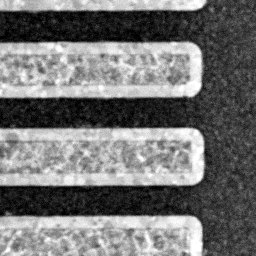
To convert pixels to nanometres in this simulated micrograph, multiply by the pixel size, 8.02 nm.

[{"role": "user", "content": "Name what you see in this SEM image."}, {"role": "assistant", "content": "one or a few lines or trenches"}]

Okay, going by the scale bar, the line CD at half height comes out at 0.368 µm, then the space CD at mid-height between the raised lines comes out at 330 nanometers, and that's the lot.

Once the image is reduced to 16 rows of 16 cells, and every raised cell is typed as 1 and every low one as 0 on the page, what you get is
0000000000000000
0000000000000000
0000000000000000
1111111111110000
1111111111110000
1111111111110000
0000000000000000
0000000000000000
1111111111110000
1111111111110000
1111111111110000
0000000000000000
0000000000000000
0000000000000000
1111111111110000
1111111111110000